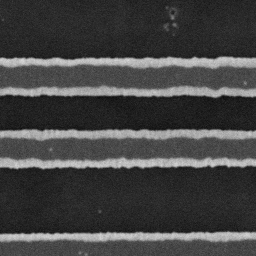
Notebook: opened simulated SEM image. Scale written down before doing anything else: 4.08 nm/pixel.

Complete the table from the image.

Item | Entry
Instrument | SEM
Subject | lines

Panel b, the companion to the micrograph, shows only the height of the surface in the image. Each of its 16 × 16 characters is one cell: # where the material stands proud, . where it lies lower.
................
................
................
................
################
################
................
................
################
################
................
................
................
................
................
################